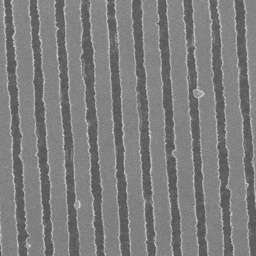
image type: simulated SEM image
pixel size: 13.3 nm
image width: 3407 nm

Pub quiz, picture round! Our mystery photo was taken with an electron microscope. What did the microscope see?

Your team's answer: parallel lines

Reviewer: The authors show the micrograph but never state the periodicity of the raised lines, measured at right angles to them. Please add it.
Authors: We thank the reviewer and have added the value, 341 nm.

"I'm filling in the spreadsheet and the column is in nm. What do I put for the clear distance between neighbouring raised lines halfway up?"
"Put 120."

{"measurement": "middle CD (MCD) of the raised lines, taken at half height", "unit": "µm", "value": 0.221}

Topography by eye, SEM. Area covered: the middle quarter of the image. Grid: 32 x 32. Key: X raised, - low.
-XXX----XXX---XXXX--XXXX---XXXX-
-XXXX---XXX---XXXX--XXXX---XXXX-
-XXXX---XXXX--XXXX---XXX---XXXX-
-XXXX---XXXX--XXXX---XXX---XXXXX
-XXXX---XXXX--XXXX---XXXX--XXXX-
-XXXX---XXXX--XXXX---XXXX--XXXX-
-XXXX---XXXX--XXXX---XXXX--XXXX-
-XXXX---XXXX--XXXX---XXXX--XXXX-
-XXXX---XXXX--XXXX---XXXX--XXXX-
-XXXX---XXXX---XXX-X-XXXX--XXXX-
--XXX---XXXX--XXXX-X-XXXX--XXXX-
--XXXX--XXXX--XXXX---XXXX--XXXX-
--XXX---XXXX---XXXX--XXXX--XXXX-
--XXX---XXXX---XXXX--XXXX--XXXXX
--XXXX---XXX---XXXXX-XXXX--XXXXX
--XXXX---XXX---XXXX--XXXX---XXXX
--XXXX--XXXX---XXXX--XXXX---XXXX
--XXXX--XXXX---XXXX--XXXX---XXXX
--XXXX--XXXX---XXXX---XXX---XXXX
--XXXX--XXXXX--XXXX---XXX---XXXX
--XXXX---XXXX--XXXX--XXXX---XXXX
-X-XXX---XXXX--XXXX--XXXX---XXXX
-X-XXX---XXXX--XXXX---XXX--XXXXX
-XXXXXX--XXXX--XXXX---XXX---XXXX
--XXXX---XXXX--XXXX---XXXX--XXXX
---XXXX--XXXX--XXXX---XXXX--XXXX
---XXXX--XXXX--XXXXX--XXXX--XXXX
---XXXX--XXXX--XXXXX--XXXX--XXXX
---XXXX--XXXX---XXX---XXXX--XXXX
---XXXX--XXXX---XXX---XXXX--XXXX
X--XXXX--XXXX---XXXX--XXXX--XXXX
X--XXXX---XXX---XXXX--XXXX--XXXX